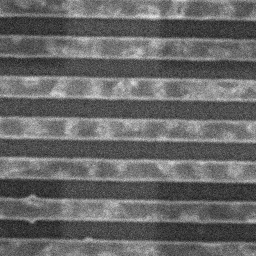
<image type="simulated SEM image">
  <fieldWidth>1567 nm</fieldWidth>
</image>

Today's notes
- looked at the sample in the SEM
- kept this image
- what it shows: parallel lines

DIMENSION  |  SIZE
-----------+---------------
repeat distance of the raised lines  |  249 nanometers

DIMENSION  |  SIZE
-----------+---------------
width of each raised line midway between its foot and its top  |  0.125 um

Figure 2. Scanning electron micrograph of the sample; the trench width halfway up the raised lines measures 124 nm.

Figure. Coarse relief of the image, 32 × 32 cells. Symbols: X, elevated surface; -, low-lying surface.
XXXXXXXXXXXXXXXXXXXXXXXXXXXXXXXX
XXXXXXXXXXXXXXXXXXXXXXXXXXXXXXXX
------------------------------XX
--------------------------------
--------------------------------
XXXXXXXXXXXXXXXXXXXXXXXXXXXXXXXX
XXXXXXXXXXXXXXXXXXXXXXXXXXXXXXXX
--------------------------X-----
--------------------------------
--------------------------------
XXXXXXXXXXXXXXXXXXXXXXXXXXXXXXXX
XXXXXXXXXXXXXXXXXXXXXXXXXXXXXXXX
------------------------X---XXXX
--------------------------------
--------------------------------
XXXXXXXXXXXXXXXXXXXXXXXXXXXXXXXX
XXXXXXXXXXXXXXXXXXXXXXXXXXXXXXXX
-----------------XXXXXXXXXXXXXXX
--------------------------------
--------------------------------
XXXXXXXXXXXXXXXXXXXXXXXXXXXXXXXX
XXXXXXXXXXXXXXXXXXXXXXXXXXXXXXXX
-------------XXXXXXXXXXXXXXXXXXX
--------------------------------
--------------------------------
XXXXXXXXXXXXXXXXXXXXXXXXXXXXXXXX
XXXXXXXXXXXXXXXXXXXXXXXXXXXXXXXX
---XX----XXXXXXXXXXXXXXXXXXXXXXX
--------------------------------
--------------------------------
XXXXXXXXXXXXXXXXXXXXXXXXXXXXXXXX
XXXXXXXXXXXXXXXXXXXXXXXXXXXXXXXX